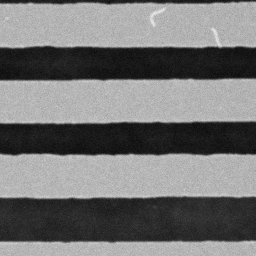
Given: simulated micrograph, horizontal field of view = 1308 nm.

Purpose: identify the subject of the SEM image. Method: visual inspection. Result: lines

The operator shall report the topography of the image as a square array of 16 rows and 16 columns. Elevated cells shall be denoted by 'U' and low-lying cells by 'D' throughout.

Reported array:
UUUUUUUUUUUUUUUU
UUUUUUUUUUUUUUUU
UUUUUUUUUUUUUUUU
DDDDDDDDDDDDDDDD
DDDDDDDDDDDDDDDD
UUUUUUUUUUUUUUUU
UUUUUUUUUUUUUUUU
UUUUUUUUUUUUUUUU
DDDDDDDDDDDDDDDD
DDDDDDDDDDDDDDDD
UUUUUUUUUUUUUUUU
UUUUUUUUUUUUUUUU
DDDDDDDDDDDDDDDD
DDDDDDDDDDDDDDDD
DDDDDDDDDDDDDDDD
UUUUUUUUUUUUUUUU